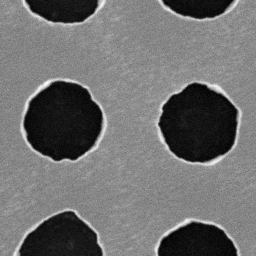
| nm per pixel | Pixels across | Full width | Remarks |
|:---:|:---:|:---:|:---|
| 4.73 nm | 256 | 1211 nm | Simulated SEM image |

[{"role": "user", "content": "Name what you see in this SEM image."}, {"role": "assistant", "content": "holes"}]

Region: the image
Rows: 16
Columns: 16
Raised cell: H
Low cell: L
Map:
HHLLLLHHHHHLLLHH
HHHHHHHHHHHHHHHH
HHHHHHHHHHHHHHHH
HHHHHHHHHHHHHHHH
HHHHHHHHHHHHHHHH
HHHLLHHHHHHHLHHH
HHLLLLHHHHLLLLLH
HLLLLLHHHHLLLLLH
HHLLLLHHHHLLLLLH
HHLLLHHHHHHLLLHH
HHHHHHHHHHHHHHHH
HHHHHHHHHHHHHHHH
HHHHHHHHHHHHHHHH
HHHLLHHHHHHHHHHH
HHLLLLHHHHHLLLHH
HLLLLLHHHHLLLLLH